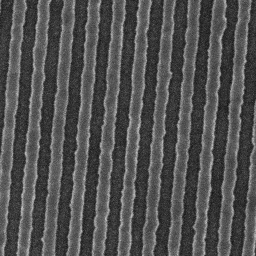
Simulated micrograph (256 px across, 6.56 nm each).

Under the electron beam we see parallel lines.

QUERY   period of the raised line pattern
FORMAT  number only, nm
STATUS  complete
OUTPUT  163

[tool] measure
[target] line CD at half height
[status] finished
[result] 76.8 nanometers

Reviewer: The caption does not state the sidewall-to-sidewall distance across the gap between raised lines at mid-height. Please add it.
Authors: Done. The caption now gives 0.085 micrometres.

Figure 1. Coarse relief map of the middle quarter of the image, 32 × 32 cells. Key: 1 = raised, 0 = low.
10000111000111000111000111000011
10000111000111000111000011000011
10000111000111000111000111100011
10001111000111000111000111100011
10001111000111000111000011000011
10001110000111000111000111000011
10001110000111000111000111000111
10001110000111000111000111000111
10001110001110000111000111000111
10001110001110000110000111000111
10001110001110000111000110000111
10001110001110000110000110000111
00001110001110001110001110000111
00001110001110001110001110000111
00001100001110000110000110000111
00001100001110001110001110001111
00001100001110001110001110000111
00011100011100001110001110000110
00011100011100001110001110001110
00011100011110001110001110001110
00011100011100001110001110001110
00011100011100001100001110001110
00011100011100001100001110001110
00011100011100011100001110001110
00011100011100011100001110001110
00011100011100011100011110001110
00011100011100001100011100001110
00011000011000011100011100011100
00111000011100011100011100001100
00111000011000011100011100011100
00011000111000011000011100011100
00111000111000011100011100011100